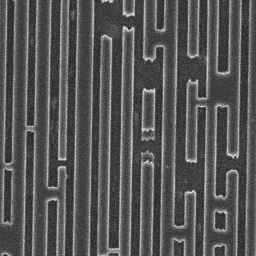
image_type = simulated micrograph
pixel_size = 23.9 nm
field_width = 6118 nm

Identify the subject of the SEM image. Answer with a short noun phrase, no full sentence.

parallel lines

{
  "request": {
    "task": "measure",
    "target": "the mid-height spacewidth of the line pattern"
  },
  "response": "0.227 microns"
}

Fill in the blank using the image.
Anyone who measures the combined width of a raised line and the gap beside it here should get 512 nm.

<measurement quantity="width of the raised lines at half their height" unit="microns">0.275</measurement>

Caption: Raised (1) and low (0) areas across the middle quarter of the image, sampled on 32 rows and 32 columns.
10011110011100011000000001110000
10011110011100011000000001110000
10011110011100011000000001110000
10011110011100011000000001110000
10011110011100011000000001110001
10011110011100011000000001110001
10011110011100011000100001110001
10011110011100011000111001110001
10011110011100011000111001110001
10011110011100011000111001110001
10011110011100011000111001110001
10011110011100011000111001110001
10011110011100011000111001110001
10011110011100011000110001110001
10011110011000011000110001110001
00011110011000011000110001110001
00011110011000011000100001110001
00011110011000011000000001110001
00011110011000011000000001110001
00011110011000011000000001110001
00011110011000111000000001110001
00011110011000111000000001110001
00011110011000111000000001110001
00011110011000111000000001110001
00011110011000111000100001110000
00011110011000111001110001110000
00011110011000111001110001110000
00011100011000111001110001110000
00011100011000111001110001100000
00011100011000111001110001100000
00011100011000111001110001100000
00011100011000111001110001100000